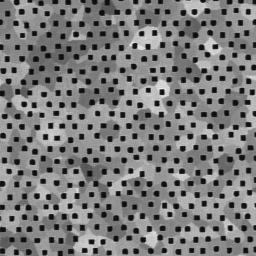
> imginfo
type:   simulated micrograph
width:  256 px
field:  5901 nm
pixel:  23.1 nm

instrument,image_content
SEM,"a regular array of holes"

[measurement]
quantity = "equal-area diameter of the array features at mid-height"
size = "142 nanometers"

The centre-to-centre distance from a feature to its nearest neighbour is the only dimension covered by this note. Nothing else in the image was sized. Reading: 11.3 px